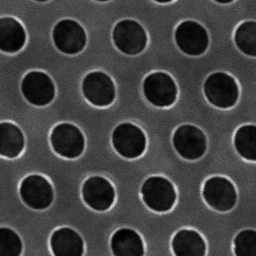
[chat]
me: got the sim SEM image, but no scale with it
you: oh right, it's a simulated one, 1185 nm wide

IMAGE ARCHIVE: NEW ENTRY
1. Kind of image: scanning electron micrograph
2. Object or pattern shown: a regular array of holes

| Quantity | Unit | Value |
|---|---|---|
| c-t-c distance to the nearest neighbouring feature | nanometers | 277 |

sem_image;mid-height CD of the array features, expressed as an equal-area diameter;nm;161